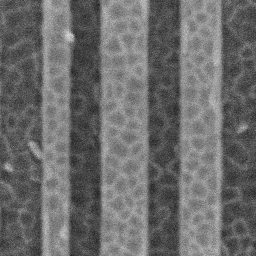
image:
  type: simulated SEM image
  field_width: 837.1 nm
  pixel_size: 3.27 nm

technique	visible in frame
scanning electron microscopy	one or a few lines or trenches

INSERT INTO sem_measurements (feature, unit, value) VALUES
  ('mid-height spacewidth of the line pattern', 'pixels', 34.8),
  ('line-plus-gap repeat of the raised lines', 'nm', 237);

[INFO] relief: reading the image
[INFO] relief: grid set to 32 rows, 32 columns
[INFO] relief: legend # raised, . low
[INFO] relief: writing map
......##.....#####.....####.....
......##.....#####.....####.....
......##.....#####.....####.....
......##.....#####.....####.....
......###....#####.....####.....
......###....#####.....####.....
......##.....#####.....#####....
......##.....#####.....#####....
......##.....#####.....#####....
......##.....#####.....#####....
......##.....#####.....#####....
......###....#####.....#####....
......###....#####.....#####....
......###....#####.....#####....
.....####....#####.....####.....
.....###.....#####.....####.....
.....###.....#####.....####.....
......##.....#####.....####.....
......##.....#####.....####.....
.....###.....#####.....####.....
.....####....#####.....####.....
......###....#####.....####.....
.....###.....#####.....####.....
.....###.....#####.....####.....
......##.....#####.....####.....
......##.....#####.....####.....
......##.....#####.....####.....
......##.....#####.....####.....
......##.....#####.....####.....
......##.....#####.....####.....
......##.....#####.....####.....
......##.....#####.....####.....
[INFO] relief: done